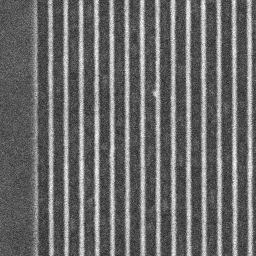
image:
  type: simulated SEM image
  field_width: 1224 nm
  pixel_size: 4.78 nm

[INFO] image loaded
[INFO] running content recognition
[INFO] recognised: parallel lines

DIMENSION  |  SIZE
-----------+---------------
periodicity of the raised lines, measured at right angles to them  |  73.2 nm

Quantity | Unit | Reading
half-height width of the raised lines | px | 3.49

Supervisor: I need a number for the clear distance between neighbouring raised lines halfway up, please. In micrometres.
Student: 0.0549